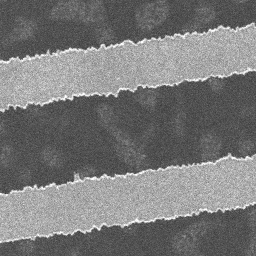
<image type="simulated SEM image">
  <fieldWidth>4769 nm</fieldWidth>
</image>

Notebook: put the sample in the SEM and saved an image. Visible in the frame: one or a few lines or trenches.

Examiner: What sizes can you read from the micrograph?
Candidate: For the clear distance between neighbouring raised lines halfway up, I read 1550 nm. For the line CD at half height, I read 892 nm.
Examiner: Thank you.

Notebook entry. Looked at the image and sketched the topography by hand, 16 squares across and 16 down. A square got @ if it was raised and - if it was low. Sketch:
----------------
----------------
---------@@@@@@@
--@@@@@@@@@@@@@@
@@@@@@@@@@@@@@@-
@@@@@@@@@-------
@@--------------
----------------
----------------
----------------
----------@@@@@@
----@@@@@@@@@@@@
@@@@@@@@@@@@@@@@
@@@@@@@@@@@-----
@@@@@-----------
----------------